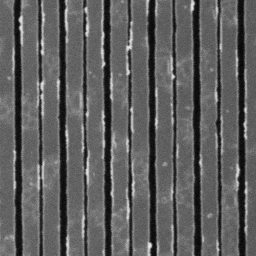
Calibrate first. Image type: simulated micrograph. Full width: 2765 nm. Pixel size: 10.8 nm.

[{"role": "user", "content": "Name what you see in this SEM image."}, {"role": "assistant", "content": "parallel lines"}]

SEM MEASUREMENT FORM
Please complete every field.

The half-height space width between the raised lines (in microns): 0.0689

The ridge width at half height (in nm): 182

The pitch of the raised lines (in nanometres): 239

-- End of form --